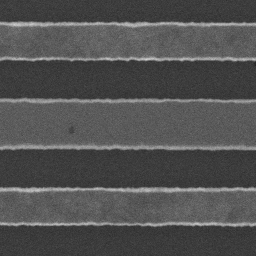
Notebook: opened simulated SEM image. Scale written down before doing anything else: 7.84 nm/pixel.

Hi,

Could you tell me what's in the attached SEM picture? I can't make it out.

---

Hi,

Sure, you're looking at lines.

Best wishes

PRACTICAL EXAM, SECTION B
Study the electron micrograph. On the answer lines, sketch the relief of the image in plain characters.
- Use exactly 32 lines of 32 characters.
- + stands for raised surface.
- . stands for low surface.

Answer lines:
................................
................................
................................
++++++++++++++++++++++++++++++++
++++++++++++++++++++++++++++++++
++++++++++++++++++++++++++++++++
++++++++++++++++++++++++++++++++
....................+........+++
................................
................................
................................
................................
++++++++++++++++++++++++++++++++
++++++++++++++++++++++++++++++++
++++++++++++++++++++++++++++++++
++++++++++++++++++++++++++++++++
++++++++++++++++++++++++++++++++
++++++++++++++++++++++++++++++++
++++++++++++++++++++++++++++++++
................................
................................
................................
................................
.............................+..
++++++++++++++++++++++++++++++++
++++++++++++++++++++++++++++++++
++++++++++++++++++++++++++++++++
++++++++++++++++++++++++++++++++
................................
................................
................................
................................